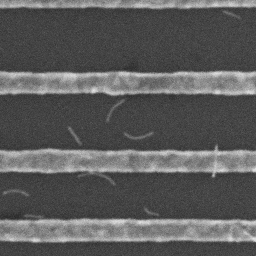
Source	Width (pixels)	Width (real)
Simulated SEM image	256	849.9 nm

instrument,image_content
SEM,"lines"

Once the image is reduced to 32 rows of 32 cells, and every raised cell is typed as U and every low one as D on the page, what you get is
UUUUUUUUUUUUUUUUUUUUUUUUUUUUUUUU
DDDDDDDDDDDDDDDDDDDDDDDDDDDDDDDD
DDDDDDDDDDDDDDDDDDDDDDDDDDDDDDDD
DDDDDDDDDDDDDDDDDDDDDDDDDDDDDDDD
DDDDDDDDDDDDDDDDDDDDDDDDDDDDDDDD
DDDDDDDDDDDDDDDDDDDDDDDDDDDDDDDD
DDDDDDDDDDDDDDDDDDDDDDDDDDDDDDDD
DDDDDDDDDDDDDDDDDDDDDDDDDDDDDDDD
DDDDDDDDDDDDDDDDDDDDDDDDDDDDDDDD
UUUUUUUUUUUUUUUUUUUUUUUUUUUUUUUU
UUUUUUUUUUUUUUUUUUUUUUUUUUUUUUUU
UUUUUUUUUDDDDUUUUUUUDUUUUUUUUUUU
DDDDDDDDDDDDDDDDDDDDDDDDDDDDDDDD
DDDDDDDDDDDDDDDDDDDDDDDDDDDDDDDD
DDDDDDDDDDDDDDDDDDDDDDDDDDDDDDDD
DDDDDDDDDDDDDDDDDDDDDDDDDDDDDDDD
DDDDDDDDDDDDDDDDDDDDDDDDDDDDDDDD
DDDDDDDDDDDDDDDDDDDDDDDDDDDDDDDD
DDDDDDDDDDDDDDDDDDDDDDDDDDDDDDDD
UUUUUUUUUUUUUUUUUUUUUUUUUUUUUUUU
UUUUUUUUUUUUUUUUUUUUUUUUUUUUUUUU
DDDDDDUDDDDDDDDDDDDDDDDDDDUDDDDD
DDDDDDDDDDDDDDDDDDDDDDDDDDDDDDDD
DDDDDDDDDDDDDDDDDDDDDDDDDDDDDDDD
DDDDDDDDDDDDDDDDDDDDDDDDDDDDDDDD
DDDDDDDDDDDDDDDDDDDDDDDDDDDDDDDD
DDDDDDDDDDDDDDDDDDDDDDDDDDDDDDDD
DDDDDDDDDDDDDDDDDDDDDDDDDDDDDDDD
UUUUUUUUUUUUUUUUUUUUUUUUUUUUUUUU
UUUUUUUUUUUUUUUUUUUUUUUUUUUUUUUU
DDDDDDDDDDDDDDDDDDDDDDDDDDDDDDDD
DDDDDDDDDDDDDDDDDDDDDDDDDDDDDDDD